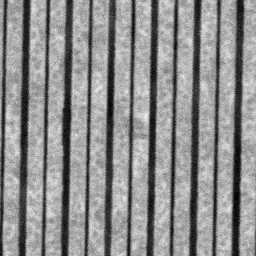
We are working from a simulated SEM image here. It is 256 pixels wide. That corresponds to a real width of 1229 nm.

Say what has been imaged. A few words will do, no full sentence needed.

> parallel lines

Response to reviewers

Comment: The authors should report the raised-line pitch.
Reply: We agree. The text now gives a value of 102 nanometres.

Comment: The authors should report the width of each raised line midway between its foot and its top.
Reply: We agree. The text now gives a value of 70.7 nm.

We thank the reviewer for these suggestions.